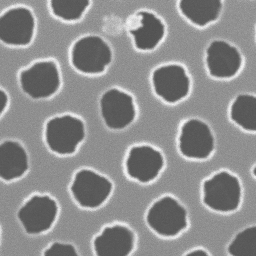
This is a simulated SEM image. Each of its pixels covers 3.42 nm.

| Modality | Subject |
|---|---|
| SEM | a regular array of holes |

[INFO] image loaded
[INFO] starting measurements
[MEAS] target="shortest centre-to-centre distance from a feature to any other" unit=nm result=194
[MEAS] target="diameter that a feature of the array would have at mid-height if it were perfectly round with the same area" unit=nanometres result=127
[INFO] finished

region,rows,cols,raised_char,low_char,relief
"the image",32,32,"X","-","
XXXXXX-----XXXXXXXXXXX------XXXX
X---XXX---XXXXXXXXXXXXX----XXXXX
----XXXXXXXXXXXXXX--XXXX---XXXXX
----XXXXXXXXXXXXX---XXXXXXXXXXXX
----XXXXXXXXXXXXX---XXXXXXXXXXXX
X--XXXXXX----XXXX---XXXXXX--XXXX
XXXXXXXXX-----XXXXXXXXXXXX----XX
XXXXXXXXX-----XXXXXXXXXXXX----XX
XXXX---XXX---XXXXXXX---XXX----XX
XXX----XXXXXXXXXXXX----XXXX--XXX
XXX----XXXXXXXXXXXX-----XXXXXXXX
XXX----XXXXXX--XXXX----XXXXXXXXX
-XXXXXXXXXXXX----XXXX-XXXXXXX---
-XXXXXXXXXXXX----XXXXXXXXXXXX---
XXXXXXXX-XXXX----XXXXXXXXXXXX---
XXXXXX----XXX---XXXXXXX---XXXX--
XXXXXX-----XXXXXXXXXXXX---XXXXXX
XXXXXX----XXXXXXXXXXXX-----XXXXX
---XXX----XXXXXXX--XXX-----XXXXX
---XXXXXXXXXXXXX----XXX---XXXXXX
---XXXXXXXXXXXXX----XXXXXXXXXXXX
---XXXXXXX--XXXX----XXXXXXXXXXXX
XXXXXXXXX----XXXX--XXXXXXX----XX
XXXXXXXXX-----XXXXXXXXXXX-----XX
XXXXXXXXX-----XXXXXXXXXXXX----XX
XXX----XXX---XXXXXX---XXXX----XX
XX-----XXXXXXXXXXXX----XXXXXXXXX
XXX----XXXXXXXXXXX-----XXXXXXXXX
XXX---XXXXXXX---XXX----XXXXXXXX-
XXXXXXXXXXXX-----XXXXXXXXXXXXX--
XXXXXXX-XXXX----XXXXXXXXXXXXX---
XXXXXX---XXX----XXXXXXXX--XXX---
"